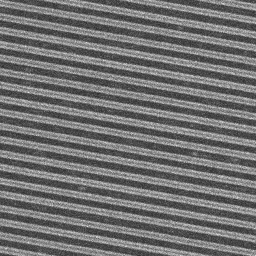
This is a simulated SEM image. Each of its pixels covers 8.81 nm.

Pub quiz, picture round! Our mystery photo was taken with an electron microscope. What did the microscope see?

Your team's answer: parallel lines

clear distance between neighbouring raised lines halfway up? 8.85 pixels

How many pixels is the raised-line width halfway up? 4.8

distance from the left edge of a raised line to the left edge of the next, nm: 119